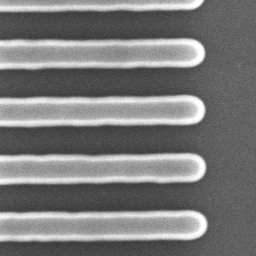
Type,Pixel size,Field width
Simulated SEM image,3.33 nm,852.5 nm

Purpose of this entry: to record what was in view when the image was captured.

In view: groups of lines, slits or small figures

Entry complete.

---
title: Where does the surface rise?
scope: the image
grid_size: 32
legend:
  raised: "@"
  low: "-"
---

@@@@@@@@@@@@@@@@@@@@@@@@@-------
--------------------------------
--------------------------------
--------------------------------
--------------------------------
@@@@@@@@@@@@@@@@@@@@@@@@--------
@@@@@@@@@@@@@@@@@@@@@@@@@-------
@@@@@@@@@@@@@@@@@@@@@@@@@-------
--------------------------------
--------------------------------
--------------------------------
--------------------------------
----@@@-@@@-@@@@@@@@@@@@--------
@@@@@@@@@@@@@@@@@@@@@@@@@-------
@@@@@@@@@@@@@@@@@@@@@@@@@-------
--------------------------------
--------------------------------
--------------------------------
--------------------------------
--------------------------------
@@@@@@@@@@@@@@@@@@@@@@@@@-------
@@@@@@@@@@@@@@@@@@@@@@@@@-------
@@@@@@@@@@@@@@-@@@-@@@----------
--------------------------------
--------------------------------
--------------------------------
--------------------------------
@@@@@@@@@@@@@@@@@@@@@@@@@-------
@@@@@@@@@@@@@@@@@@@@@@@@@-------
@@@@@@@@@@@@@@@@@@@@@@@@--------
--------------------------------
--------------------------------